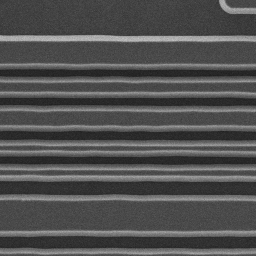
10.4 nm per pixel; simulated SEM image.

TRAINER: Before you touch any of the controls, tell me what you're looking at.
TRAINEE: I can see groups of lines, slits or small figures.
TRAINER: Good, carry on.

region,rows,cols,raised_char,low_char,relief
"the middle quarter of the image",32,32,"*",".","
.******....*************........
................................
................................
................................
********************************
********************************
********************************
********************************
................................
................................
................................
********************************
********************************
********************************
********************************
********************************
................................
................................
................................
................................
********************************
********************************
................................
................................
................................
................................
********************************
********************************
********************************
................................
................................
................................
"